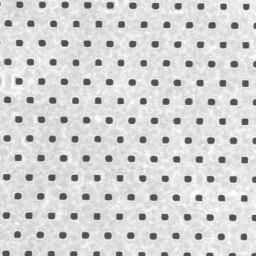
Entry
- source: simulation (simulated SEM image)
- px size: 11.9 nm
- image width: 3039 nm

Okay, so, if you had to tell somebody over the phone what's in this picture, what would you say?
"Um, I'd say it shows a regular array of holes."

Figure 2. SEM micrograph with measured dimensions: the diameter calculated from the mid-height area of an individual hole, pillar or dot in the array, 7.73 pixels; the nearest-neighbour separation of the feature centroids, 259 nanometres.